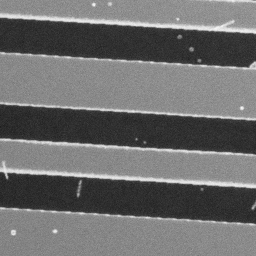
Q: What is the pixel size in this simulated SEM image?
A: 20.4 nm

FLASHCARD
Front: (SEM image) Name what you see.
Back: lines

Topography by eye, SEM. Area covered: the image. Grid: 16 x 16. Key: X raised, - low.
XXXXXXXXXXXXXXXX
--------XXXXXXXX
----------------
XXX-------------
XXXXXXXXXXXXXXXX
XXXXXXXXXXXXXXXX
XXXXXXXXXXXXXXXX
----------------
----------------
XXXXXXXXXXXXX---
XXXXXXXXXXXXXXXX
-------------XXX
----------------
XXXXXXXX--------
XXXXXXXXXXXXXXXX
XXXXXXXXXXXXXXXX